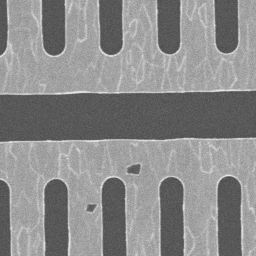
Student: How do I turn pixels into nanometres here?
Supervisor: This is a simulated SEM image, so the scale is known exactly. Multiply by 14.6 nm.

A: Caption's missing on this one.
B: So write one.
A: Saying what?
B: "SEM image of groups of lines, slits or small figures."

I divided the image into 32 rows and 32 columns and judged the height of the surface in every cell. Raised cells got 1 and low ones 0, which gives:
01111000111100011111000111100011
01111000111100011111000111100011
01111000111100011111000111100011
01111000111100011111000111100011
01111000111100011111000111100011
01111000111100011111000111100011
01111100111110011111001111110111
11111111111111111111111111111111
11111111111111111111111111111111
11111111111111111111111111111111
11111111111111111111111111111111
11111111110111111011000000000000
00000000000000000000000000000000
00000000000000000000000000000000
00000000000000000000000000000000
00000000000000000000000000000000
00000000000000000000000000000000
00000000000000111000011111111111
11111111111111111111111111111111
11111111111111111111111111111111
11111111111111111111111111111111
11111111111111111111111111111111
11111100111110011111001111110011
01111100111110001111000111100011
01111000011110001111000111100011
01111000011110001111000111100011
01111000011110001111000111100011
01111000011110001111000111100011
01111000011110001111000111100011
01111100011110001111000111100011
01111100011110001111000111100011
00111100011110001111000111100011